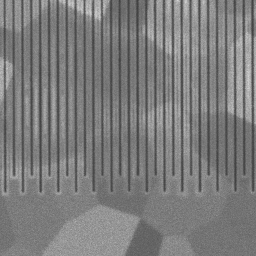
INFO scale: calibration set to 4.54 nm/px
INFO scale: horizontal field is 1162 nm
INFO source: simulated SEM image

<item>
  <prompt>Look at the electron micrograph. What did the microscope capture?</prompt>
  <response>parallel lines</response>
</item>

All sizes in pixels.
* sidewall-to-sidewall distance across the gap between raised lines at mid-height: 1.87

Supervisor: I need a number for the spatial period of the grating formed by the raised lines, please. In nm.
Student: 40.2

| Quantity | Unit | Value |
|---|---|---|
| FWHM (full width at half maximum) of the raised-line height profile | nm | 29.5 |